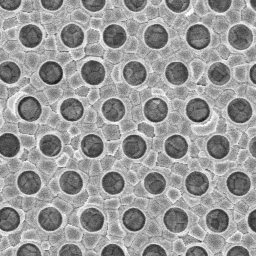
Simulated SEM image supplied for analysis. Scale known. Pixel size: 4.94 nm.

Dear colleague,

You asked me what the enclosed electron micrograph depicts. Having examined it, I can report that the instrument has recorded a regular array of holes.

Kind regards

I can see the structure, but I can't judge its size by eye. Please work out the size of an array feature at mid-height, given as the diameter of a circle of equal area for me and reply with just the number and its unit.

121 nm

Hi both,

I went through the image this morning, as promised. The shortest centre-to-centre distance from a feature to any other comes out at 205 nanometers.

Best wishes